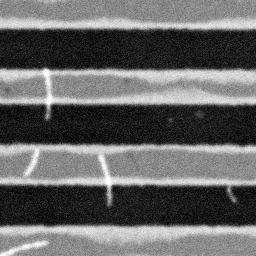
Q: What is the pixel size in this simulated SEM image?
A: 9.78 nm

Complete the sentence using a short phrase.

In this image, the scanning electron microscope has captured lines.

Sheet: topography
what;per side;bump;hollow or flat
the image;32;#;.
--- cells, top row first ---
################################
################################
################################
................................
................................
................................
................................
................................
................................
################################
################################
################################
######################...#######
................................
................................
................................
................................
................................
################################
################################
################################
################################
################################
................................
................................
................................
................................
................................
....##...................#......
################################
################################
################################